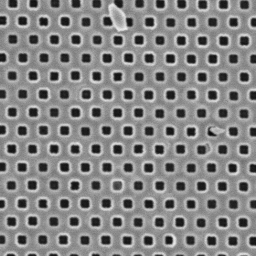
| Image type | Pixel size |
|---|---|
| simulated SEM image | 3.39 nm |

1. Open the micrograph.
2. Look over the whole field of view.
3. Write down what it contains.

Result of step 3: a regular array of holes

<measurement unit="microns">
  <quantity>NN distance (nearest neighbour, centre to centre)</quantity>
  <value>0.0698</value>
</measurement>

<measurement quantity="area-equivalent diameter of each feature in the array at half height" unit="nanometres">32.9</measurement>